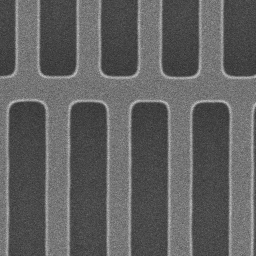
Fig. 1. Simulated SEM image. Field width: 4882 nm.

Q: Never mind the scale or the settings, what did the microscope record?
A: groups of lines, slits or small figures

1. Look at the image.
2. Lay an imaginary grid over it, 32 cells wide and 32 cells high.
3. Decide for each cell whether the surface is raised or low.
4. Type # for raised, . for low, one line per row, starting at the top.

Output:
..###.....###....###.....###....
..###.....###....###.....###....
..###.....###....###.....###....
..###.....###....###.....###....
..###.....###....###.....###....
..###.....###....###.....###....
..###.....###....###.....###....
..###.....###....###.....###....
..###.....###....###.....###....
.#####...####...#####...#####...
################################
################################
################################
#.....###....###.....###.....###
#.....###....###.....###.....###
#.....###....###.....###.....###
#.....###....###.....###.....###
#.....###....###.....###.....###
#.....###....###.....###.....###
#.....###....###.....###.....###
#.....###....###.....###.....###
#.....###....###.....###.....###
#.....###....###.....###.....###
#.....###....###.....###.....###
#.....###....###.....###.....###
#.....###....###.....###.....###
#.....###....###.....###.....###
#.....###....###.....###.....###
#.....###....###.....###.....###
#.....###....###.....###.....###
#.....###....###.....###.....###
#.....###....###.....###.....###